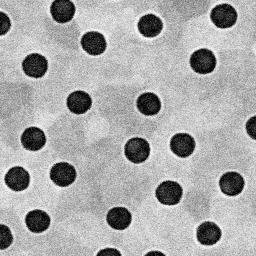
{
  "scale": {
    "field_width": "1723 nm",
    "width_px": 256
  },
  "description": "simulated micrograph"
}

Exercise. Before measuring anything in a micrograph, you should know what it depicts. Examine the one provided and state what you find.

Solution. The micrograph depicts a regular array of holes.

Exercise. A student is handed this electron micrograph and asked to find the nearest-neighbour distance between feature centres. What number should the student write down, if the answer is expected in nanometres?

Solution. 336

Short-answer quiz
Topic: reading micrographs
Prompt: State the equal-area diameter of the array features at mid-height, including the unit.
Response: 178 nm